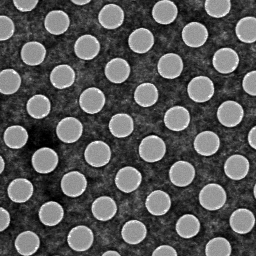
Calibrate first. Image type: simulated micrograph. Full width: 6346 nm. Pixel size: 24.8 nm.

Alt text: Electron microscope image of a regular array of raised bodies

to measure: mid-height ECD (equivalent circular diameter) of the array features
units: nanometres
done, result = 629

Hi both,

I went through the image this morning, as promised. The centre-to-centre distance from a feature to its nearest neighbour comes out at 936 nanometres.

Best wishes